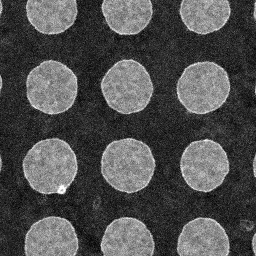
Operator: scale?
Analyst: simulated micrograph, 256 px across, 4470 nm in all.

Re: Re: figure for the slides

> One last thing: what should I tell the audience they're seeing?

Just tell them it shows raised bodies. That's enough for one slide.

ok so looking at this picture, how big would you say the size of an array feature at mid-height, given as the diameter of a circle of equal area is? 903 nm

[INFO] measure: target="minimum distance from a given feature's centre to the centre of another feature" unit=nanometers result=1330